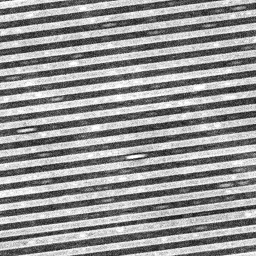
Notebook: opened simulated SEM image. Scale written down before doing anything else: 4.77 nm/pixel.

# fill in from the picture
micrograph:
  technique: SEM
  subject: parallel lines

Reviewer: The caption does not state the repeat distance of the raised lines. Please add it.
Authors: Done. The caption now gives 63.5 nm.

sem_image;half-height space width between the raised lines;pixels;7.17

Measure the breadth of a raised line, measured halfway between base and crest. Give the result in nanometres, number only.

29.5